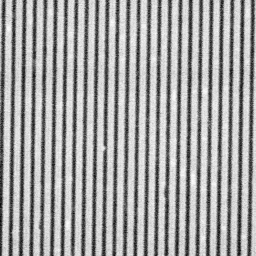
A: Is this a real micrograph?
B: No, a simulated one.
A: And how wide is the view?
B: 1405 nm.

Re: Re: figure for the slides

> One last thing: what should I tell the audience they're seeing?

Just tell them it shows parallel lines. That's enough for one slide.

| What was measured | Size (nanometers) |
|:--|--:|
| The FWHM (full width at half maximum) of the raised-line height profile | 28.8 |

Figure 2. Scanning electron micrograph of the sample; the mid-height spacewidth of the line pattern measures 28.8 nanometres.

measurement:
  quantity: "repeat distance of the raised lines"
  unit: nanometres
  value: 57